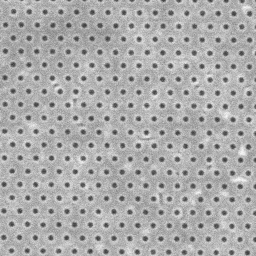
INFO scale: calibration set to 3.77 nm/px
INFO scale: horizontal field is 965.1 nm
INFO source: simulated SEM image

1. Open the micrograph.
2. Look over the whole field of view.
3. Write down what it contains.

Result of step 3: a regular array of holes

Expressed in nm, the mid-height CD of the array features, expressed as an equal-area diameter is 22.5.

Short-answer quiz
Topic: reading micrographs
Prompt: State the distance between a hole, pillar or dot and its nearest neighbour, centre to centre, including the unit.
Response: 15 px